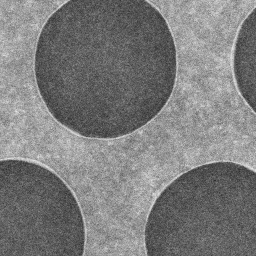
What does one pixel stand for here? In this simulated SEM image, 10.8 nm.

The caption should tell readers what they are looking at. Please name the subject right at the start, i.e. holes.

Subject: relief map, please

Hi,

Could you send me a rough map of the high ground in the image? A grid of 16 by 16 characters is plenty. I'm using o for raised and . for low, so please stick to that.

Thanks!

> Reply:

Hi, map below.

oooo......oooooo
ooo.......ooooo.
oo.........oooo.
oo.........oooo.
oo.........oooo.
oo.........oooo.
ooo.......oooooo
oooo.....ooooooo
ooooo...oooooooo
oooooooooooooooo
...ooooooooo...o
....ooooooo.....
.....ooooo......
.....oooo.......
.....oooo.......
.....oooo.......